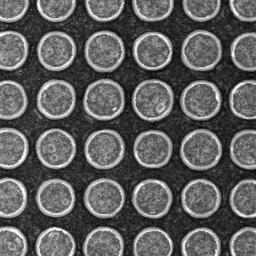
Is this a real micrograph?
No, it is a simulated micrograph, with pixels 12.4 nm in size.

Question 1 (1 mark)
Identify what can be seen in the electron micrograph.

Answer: a regular array of raised bodies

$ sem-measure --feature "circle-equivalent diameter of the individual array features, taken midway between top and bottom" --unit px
37.5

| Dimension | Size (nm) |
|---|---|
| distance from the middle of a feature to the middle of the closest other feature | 598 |